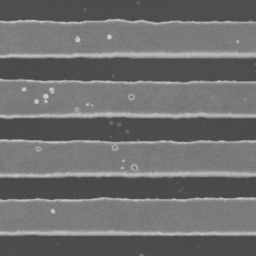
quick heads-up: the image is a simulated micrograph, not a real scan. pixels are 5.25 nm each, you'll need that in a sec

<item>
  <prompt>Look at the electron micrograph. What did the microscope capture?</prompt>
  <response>lines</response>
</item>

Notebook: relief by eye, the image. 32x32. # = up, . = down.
................................
................................
.............###................
################################
################################
################################
################################
................................
................................
................................
################################
################################
################################
################################
################################
................................
................................
................................
################################
################################
################################
################################
................................
................................
................................
################################
################################
################################
################################
................................
................................
................................